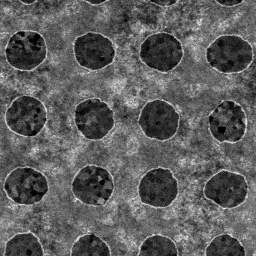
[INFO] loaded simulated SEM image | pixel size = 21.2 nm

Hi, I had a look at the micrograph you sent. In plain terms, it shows a regular array of raised bodies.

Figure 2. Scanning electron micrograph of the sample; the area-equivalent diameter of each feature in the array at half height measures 865 nm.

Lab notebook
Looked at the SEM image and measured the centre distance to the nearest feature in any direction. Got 1410 nm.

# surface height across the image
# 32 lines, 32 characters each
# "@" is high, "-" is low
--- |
-----------@@------@@@------@@--
--------------------------------
--------------------------------
--------------------------------
--@@@-----@@@------@@@------@@--
-@@@@@---@@@@@----@@@@@---@@@@@-
-@@@@@---@@@@@---@@@@@@---@@@@@@
-@@@@@----@@@@----@@@@@---@@@@@@
--@@-------@@------@@@-----@@@@-
--------------------------------
--------------------------------
--------------------------------
--@@@------@@------@------------
-@@@@@----@@@@----@@@@-----@@@--
-@@@@@---@@@@@---@@@@@----@@@@@-
-@@@@@---@@@@@---@@@@@----@@@@@-
--@@@-----@@@@----@@@@----@@@@@-
-----------@--------@------@@@--
--------------------------------
--------------------------------
--------------------------------
-@@@@-----@@@@-----@@------@@---
-@@@@@---@@@@@----@@@@----@@@@@-
-@@@@@---@@@@@---@@@@@---@@@@@@-
-@@@@@---@@@@@---@@@@@----@@@@@-
---@-------@@-----@@@------@@@--
--------------------------------
--------------------------------
--------------------------------
--@@------@@-------@-------@@---
-@@@@----@@@@-----@@@@----@@@@--
-@@@@----@@@@@---@@@@@----@@@@@-